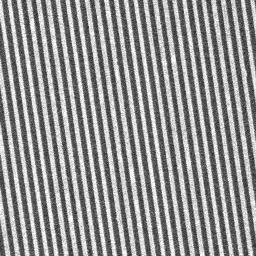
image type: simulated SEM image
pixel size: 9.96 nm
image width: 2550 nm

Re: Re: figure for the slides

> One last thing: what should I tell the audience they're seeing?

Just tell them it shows parallel lines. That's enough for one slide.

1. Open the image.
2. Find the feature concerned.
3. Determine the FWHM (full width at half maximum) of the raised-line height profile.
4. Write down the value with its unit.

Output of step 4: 34.5 nm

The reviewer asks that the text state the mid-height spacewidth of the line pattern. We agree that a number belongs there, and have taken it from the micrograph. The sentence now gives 60.4 nanometres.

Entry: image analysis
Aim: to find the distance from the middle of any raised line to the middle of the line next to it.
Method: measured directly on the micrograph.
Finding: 0.0958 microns